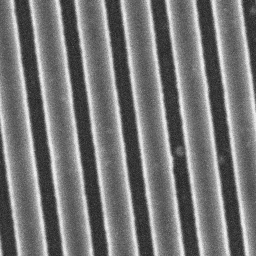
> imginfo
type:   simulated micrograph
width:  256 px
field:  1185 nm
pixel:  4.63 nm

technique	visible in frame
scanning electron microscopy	parallel lines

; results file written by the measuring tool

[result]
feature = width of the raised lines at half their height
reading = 0.128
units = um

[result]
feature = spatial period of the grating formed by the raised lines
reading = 0.209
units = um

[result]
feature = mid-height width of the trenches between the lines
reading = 81.5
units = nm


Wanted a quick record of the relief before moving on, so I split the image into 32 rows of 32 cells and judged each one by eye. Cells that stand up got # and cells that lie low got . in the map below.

##..###...###..####..###...###..
##..###...###..####..###...###..
##..####..###...###..####..###..
##..####..###...###..####..###..
##..####..####..###..####..####.
##...###..####..###...###..####.
##...###..####..###...###..####.
###..###..####..####..###...###.
###..###...###..####..###...###.
###..####..###..####..####..###.
###..####..###...###..####..###.
###..####..###...###..####..####
###..####..####..###..####..####
###...###..####..###...###..####
####..###..####..####..###..####
####..###...###..####..###...###
####..###...###..####..####..###
####..####..###...###..####..###
.###..####..###...###..####..###
.###...###..####..###..####..###
.###...###..####..###...###..###
.###...###..####..###...###..###
.####..###..####..####..###...##
.####..###...###..####..###...##
.####..####..###..####..####..##
..###..####..###...###..####..##
..###..####..####..###..####..##
..###..####..####..###...###..##
..###...###..####..###...###..##
..####..###..####..####..###...#
..####..###...###..####..###...#
..####..###...###..####..####..#